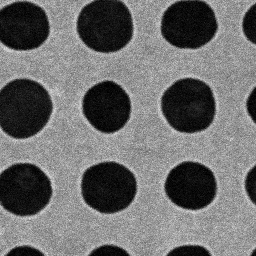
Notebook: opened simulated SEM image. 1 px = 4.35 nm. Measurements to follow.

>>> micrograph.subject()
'holes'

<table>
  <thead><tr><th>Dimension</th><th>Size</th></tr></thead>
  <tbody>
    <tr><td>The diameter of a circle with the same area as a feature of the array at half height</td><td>230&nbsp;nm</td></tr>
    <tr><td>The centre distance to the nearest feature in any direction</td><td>350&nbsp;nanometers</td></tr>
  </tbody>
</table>